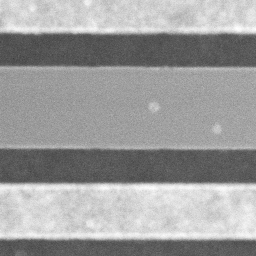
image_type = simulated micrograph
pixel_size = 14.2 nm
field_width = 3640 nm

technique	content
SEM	lines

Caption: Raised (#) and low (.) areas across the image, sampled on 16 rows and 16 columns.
################
################
................
................
################
################
################
################
################
................
................
................
################
################
################
................